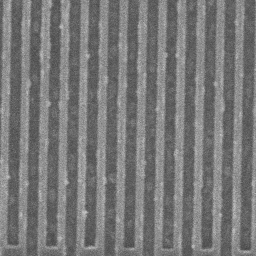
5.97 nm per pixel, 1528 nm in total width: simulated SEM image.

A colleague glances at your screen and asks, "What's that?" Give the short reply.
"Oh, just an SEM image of parallel lines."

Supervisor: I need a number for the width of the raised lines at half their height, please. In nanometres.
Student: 47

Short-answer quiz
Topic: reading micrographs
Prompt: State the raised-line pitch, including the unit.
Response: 116 nanometres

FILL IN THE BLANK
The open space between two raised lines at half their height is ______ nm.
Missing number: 67.9